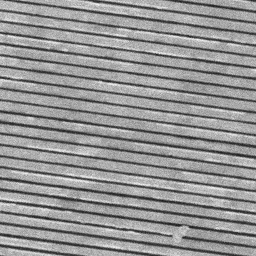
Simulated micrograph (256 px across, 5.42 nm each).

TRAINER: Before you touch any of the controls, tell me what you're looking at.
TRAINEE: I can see parallel lines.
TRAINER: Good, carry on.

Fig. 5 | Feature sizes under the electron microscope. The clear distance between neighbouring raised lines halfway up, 0.0201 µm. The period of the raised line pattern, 0.0602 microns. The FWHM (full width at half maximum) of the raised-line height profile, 40.2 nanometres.